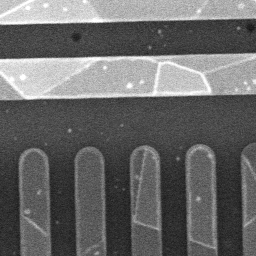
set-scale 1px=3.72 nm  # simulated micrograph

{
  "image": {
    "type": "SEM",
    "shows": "groups of lines, slits or small figures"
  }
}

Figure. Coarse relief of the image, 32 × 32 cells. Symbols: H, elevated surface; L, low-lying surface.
HHHHHHHHHHHHHHHHHHHHHHHHHHHHHHHH
HHHHHHHHHHHHHHHHHHHHHHHHHHHHHHHH
HHHHHHHHHHHHHHHHHHLLLLLLLLLLLLLL
LLLLLLLLLLLLLLLLLLLLLLLLLLLLLLLL
LLLLLLLLLLLLLLLLLLLLLLLLLLLLLLLL
LLLLLLLLLLLLLLLLLLLLLLLLLLLLLLLL
LLLLLLLLLLLLLLLLLLLLLLLLLLLLLLLL
HHHHHHHHHHHHHHHHHHHHHHHHHHHHHHHH
HHHHHHHHHHHHHHHHHHHHHHHHHHHHHHHH
HHHHHHHHHHHHHHHHHHHHHHHHHHHHHHHH
HHHHHHHHHHHHHHHHHHHHHHHHHHHHHHHH
HHHHHHHHHHHHHHHHHHHHHHHHHHHHHHHH
LLLLLLLLLLLLLLLLLLLLLLLLLLLLLLLL
LLLLLLLLLLLLLLLLLLLLLLLLLLLLLLLL
LLLLLLLLLLLLLLLLLLLLLLLLLLLLLLLL
LLLLLLLLLLLLLLLLLLLLLLLLLLLLLLLL
LLLLLLLLLLLLLLLLLLLLLLLLLLLLLLLL
LLLLLLLLLLLLLLLLLLLLLLLLLLLLLLLL
LLLLLLLLLLHHLLLLLHHLLLLLHHLLLLLH
LLLHHHLLLLHHHLLLHHHHLLLHHHHLLLHH
LLHHHHLLLHHHHLLLHHHHLLLHHHHLLLHH
LLHHHHLLLHHHHLLLHHHHLLLHHHHLLLHH
LLHHHHLLLHHHHLLLHHHHLLLHHHHLLLHH
LLHHHHLLLHHHHLLLHHHHLLLHHHHLLLHH
LLHHHHLLLHHHHLLLHHHHLLLHHHHLLLHH
LLLHHHLLLHHHHLLLHHHHLLLHHHHLLLHH
LLLHHHLLLLHHHLLLHHHHLLLHHHHLLLHH
LLLHHHLLLLHHHLLLHHHHLLLHHHHLLLHH
LLLHHHLLLLHHHLLLHHHHLLLHHHHLLLHH
LLLHHHLLLLHHHLLLHHHHLLLHHHHLLLHH
LLLHHHLLLLHHHLLLHHHHLLLLHHHLLLHH
LLLHHHLLLLHHHLLLLHHHLLLLHHHLLLHH